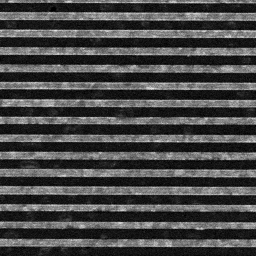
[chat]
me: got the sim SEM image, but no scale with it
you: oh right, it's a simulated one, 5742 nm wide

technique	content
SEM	parallel lines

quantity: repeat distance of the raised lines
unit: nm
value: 391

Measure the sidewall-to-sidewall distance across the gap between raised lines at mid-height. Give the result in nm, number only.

244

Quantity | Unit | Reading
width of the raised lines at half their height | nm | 143